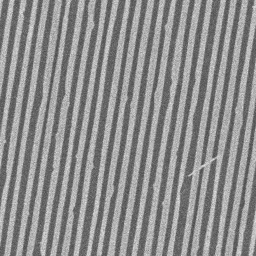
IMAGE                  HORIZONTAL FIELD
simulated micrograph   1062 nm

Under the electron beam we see parallel lines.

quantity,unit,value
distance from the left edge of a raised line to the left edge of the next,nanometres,47.7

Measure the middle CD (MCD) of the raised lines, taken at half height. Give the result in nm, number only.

24.6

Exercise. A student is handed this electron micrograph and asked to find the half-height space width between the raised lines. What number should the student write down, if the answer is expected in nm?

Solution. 24.6